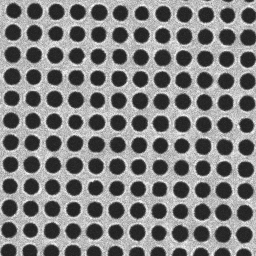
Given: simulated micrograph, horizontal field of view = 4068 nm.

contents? a regular array of holes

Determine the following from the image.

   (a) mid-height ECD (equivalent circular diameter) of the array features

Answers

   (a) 268 nm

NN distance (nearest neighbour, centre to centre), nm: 338